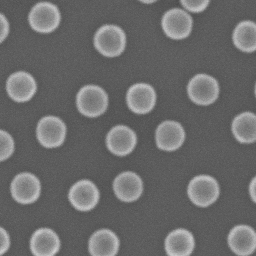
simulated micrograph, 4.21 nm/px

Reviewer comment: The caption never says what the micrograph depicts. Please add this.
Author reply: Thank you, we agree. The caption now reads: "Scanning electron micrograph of a regular array of raised bodies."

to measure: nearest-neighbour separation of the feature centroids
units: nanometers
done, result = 223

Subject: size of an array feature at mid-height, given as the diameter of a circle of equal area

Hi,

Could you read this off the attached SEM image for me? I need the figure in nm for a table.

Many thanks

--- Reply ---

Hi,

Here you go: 121